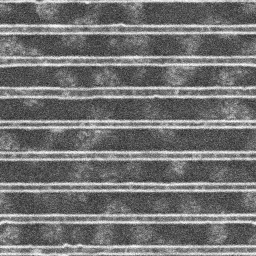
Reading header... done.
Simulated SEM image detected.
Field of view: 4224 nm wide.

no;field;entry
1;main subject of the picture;parallel lines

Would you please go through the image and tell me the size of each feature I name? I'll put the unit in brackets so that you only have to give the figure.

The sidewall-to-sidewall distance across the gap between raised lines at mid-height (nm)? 398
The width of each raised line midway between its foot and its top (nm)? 120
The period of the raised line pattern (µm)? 0.521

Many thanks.